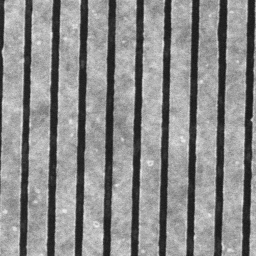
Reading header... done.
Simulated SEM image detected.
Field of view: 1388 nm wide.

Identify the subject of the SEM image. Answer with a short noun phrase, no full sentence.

parallel lines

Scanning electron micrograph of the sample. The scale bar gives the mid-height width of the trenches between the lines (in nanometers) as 44.7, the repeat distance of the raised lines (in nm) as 151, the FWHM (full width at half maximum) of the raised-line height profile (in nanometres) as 107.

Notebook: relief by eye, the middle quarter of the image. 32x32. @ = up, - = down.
@@@@@-@@@@@--@@@@@--@@@@@--@@@@@
@@@@--@@@@@--@@@@@--@@@@@--@@@@@
@@@@--@@@@@--@@@@@--@@@@@--@@@@@
@@@@--@@@@@--@@@@@--@@@@@--@@@@-
@@@@--@@@@---@@@@---@@@@---@@@@-
@@@---@@@@@--@@@@@--@@@@---@@@@-
@@@---@@@@---@@@@@--@@@@---@@@@-
@@@---@@@@---@@@@@--@@@@---@@@@-
@@@--@@@@@---@@@@@--@@@@--@@@@@-
@@@---@@@@---@@@@---@@@@--@@@@@-
@@@---@@@@---@@@@---@@@@--@@@@@-
@@@---@@@@--@@@@@@--@@@@--@@@@@-
@@@---@@@@--@@@@@@--@@@@--@@@@@-
@@@---@@@@---@@@@---@@@@---@@@@-
@@@---@@@@---@@@@---@@@@--@@@@@-
@@@---@@@@---@@@@---@@@@--@@@@@-
@@@---@@@@---@@@@---@@@@--@@@@@-
@@@--@@@@@--@@@@@--@@@@@--@@@@@-
@@@--@@@@@--@@@@@--@@@@@--@@@@@-
@@@--@@@@@--@@@@@--@@@@@--@@@@@-
@@@--@@@@@--@@@@@--@@@@@--@@@@@-
@@@--@@@@@--@@@@@--@@@@@--@@@@@-
@@@--@@@@@--@@@@@--@@@@@--@@@@@-
@@@--@@@@@--@@@@@--@@@@@--@@@@@-
@@@--@@@@@--@@@@@--@@@@@--@@@@@-
@@@--@@@@@--@@@@@--@@@@@--@@@@@-
@@@--@@@@@--@@@@@--@@@@@--@@@@@-
@@@--@@@@@--@@@@@--@@@@@--@@@@@-
@@@--@@@@@--@@@@@--@@@@@--@@@@@-
@@@--@@@@@--@@@@@--@@@@@--@@@@@-
@@@--@@@@@--@@@@@--@@@@@--@@@@@-
@@@--@@@@@--@@@@@--@@@@@--@@@@@-